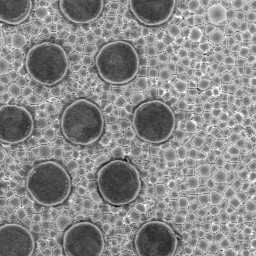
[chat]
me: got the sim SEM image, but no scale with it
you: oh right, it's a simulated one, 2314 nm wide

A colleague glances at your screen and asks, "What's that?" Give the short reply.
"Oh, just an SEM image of raised bodies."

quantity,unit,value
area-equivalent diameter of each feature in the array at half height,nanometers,379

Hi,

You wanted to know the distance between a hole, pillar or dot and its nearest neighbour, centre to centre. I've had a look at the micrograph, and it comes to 0.629 um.